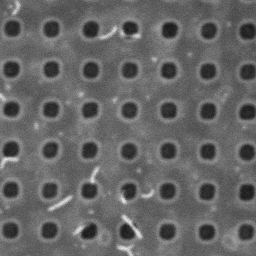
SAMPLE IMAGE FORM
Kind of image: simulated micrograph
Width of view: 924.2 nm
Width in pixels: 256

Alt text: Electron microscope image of a regular array of holes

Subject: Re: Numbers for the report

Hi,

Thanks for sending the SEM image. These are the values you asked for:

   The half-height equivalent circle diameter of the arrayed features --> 65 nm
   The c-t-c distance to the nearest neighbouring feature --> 142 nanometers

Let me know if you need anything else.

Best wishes